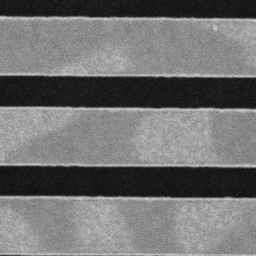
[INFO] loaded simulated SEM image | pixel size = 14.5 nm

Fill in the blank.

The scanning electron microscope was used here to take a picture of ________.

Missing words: lines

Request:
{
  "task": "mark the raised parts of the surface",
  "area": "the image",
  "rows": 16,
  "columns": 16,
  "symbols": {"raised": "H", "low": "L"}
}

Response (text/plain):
LLLLLLLLLLLLLLLL
HHHHHHHHHHHHHHHH
HHHHHHHHHHHHHHHH
HHHHHHHHHHHHHHHH
HHHHHHHHHHHHHHHH
LLLLLLLLLLLLLLLL
LLLLLLLLLLLLLLLL
HHHHHHHHHHHHHHHH
HHHHHHHHHHHHHHHH
HHHHHHHHHHHHHHHH
LLLLLLLLLLLLLLLL
LLLLLLLLLLLLLLLL
HHHHHHHHHHHHHHHH
HHHHHHHHHHHHHHHH
HHHHHHHHHHHHHHHH
HHHHHHHHHHHHHHHH